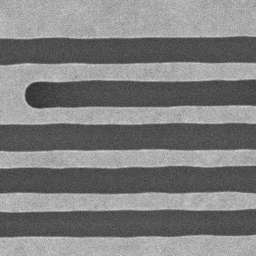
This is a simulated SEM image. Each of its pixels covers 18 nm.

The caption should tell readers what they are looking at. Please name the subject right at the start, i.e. groups of lines, slits or small figures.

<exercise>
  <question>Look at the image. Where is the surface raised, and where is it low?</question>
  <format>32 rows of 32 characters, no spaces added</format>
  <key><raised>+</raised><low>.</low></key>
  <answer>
++++++++++++++++++++++++++++++++
++++++++++++++++++++++++++++++++
++++++++++++++++++++++++++++++++
++++++++++++++++++++++++++++++++
+++++++++++++++++++++++++++++...
................................
................................
................................
++++++++++++++++++++++++++++++++
++++++++++++++++++++++++++++++++
++++............................
+++.............................
+++.............................
++++..++++++++++++++++++++++++++
++++++++++++++++++++++++++++++++
................................
................................
................................
................................
++++++++++++++++++++++++++++++++
++++++++++++++++++++++++++++++++
................................
................................
................................
++++++++++++++++++++++++++++++++
++++++++++++++++++++++++++++++++
................................
................................
................................
.........................++....+
++++++++++++++++++++++++++++++++
++++++++++++++++++++++++++++++++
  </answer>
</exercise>